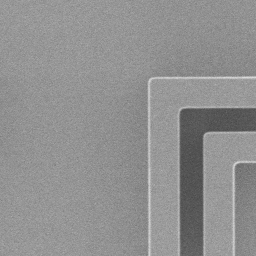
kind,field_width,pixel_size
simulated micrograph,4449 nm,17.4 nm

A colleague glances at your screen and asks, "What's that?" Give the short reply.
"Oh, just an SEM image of groups of lines, slits or small figures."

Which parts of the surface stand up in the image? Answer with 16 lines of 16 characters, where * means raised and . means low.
................
................
................
................
................
.........*******
.........*******
.........**.....
.........**..***
.........**..***
.........**..**.
.........**..**.
.........**..**.
.........**..**.
.........**..**.
.........**..**.